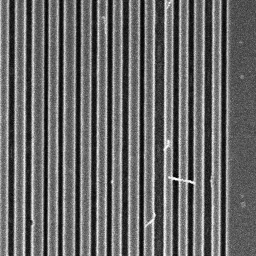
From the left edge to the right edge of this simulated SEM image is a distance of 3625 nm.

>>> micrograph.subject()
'parallel lines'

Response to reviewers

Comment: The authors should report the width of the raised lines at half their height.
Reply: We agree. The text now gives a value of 140 nm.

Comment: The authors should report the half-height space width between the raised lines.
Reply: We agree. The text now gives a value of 85 nm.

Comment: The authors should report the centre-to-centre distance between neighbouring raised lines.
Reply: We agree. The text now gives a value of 16.4 pixels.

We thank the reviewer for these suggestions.